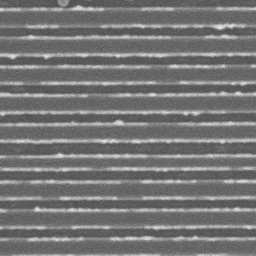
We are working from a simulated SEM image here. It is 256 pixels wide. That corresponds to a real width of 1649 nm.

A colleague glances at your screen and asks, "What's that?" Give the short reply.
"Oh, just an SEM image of parallel lines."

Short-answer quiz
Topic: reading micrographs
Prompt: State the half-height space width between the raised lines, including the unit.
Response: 0.0604 um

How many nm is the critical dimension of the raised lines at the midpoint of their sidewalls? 127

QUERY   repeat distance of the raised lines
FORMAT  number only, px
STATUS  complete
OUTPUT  28.7